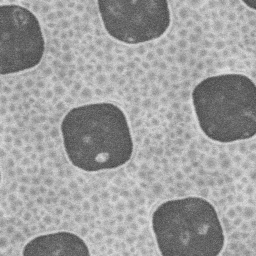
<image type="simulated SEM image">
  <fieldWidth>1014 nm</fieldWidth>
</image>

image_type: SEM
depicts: holes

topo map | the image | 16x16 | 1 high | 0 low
0011110000011111
0001110000011111
0001111000111111
0001111111111111
0011111111111111
1111111111110000
1111100111110000
1111000011110000
1111000011111000
1111000011111111
1111100111111111
1111111111111111
1111111111100111
1111111110000011
1110111111000011
1000001111000011